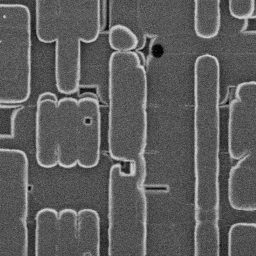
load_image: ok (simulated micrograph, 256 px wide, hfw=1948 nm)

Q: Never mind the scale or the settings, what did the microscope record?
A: wiring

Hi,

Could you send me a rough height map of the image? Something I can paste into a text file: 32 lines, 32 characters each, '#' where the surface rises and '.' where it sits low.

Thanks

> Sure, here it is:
.....#######.............##..###
####.#######............###..##.
####.#######............###.....
####.#######..#.........###.....
####.#######..###........#......
####...###....###...............
####...###....###...............
####...###....###........##.....
####...###....####......###.....
####...###....####......###.....
####...###....####......###...##
####....#.....####......###...##
###..####.##..####......###..###
.....#######..####......###..###
.....#######..####......###..###
.....#######..####......###..###
.....#######..####......###..###
.....#######..####.......##..###
.....#######..####......###..###
###..#######..####......###..###
###..#######.....#......###...##
###...........#..#.......##..###
###...........####.......##..###
###...........####.......##..###
###...........####.......##..###
###...........####.......##..###
###..##.#.##..####.......##.....
###..#######..####.......##.....
###..#######..####......###..###
###..#######..####......###..###
###.########..####......###..###
###.########..####......###..###